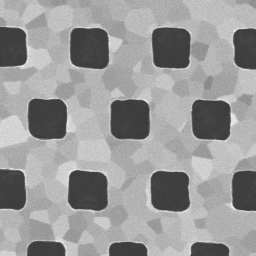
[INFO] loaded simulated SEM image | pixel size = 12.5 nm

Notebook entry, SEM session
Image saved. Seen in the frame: holes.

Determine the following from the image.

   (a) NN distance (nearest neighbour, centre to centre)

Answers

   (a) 1020 nm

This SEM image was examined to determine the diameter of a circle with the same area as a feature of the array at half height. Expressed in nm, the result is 540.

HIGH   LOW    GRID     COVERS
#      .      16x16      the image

################
################
..##...##...###.
..##...###..###.
################
################
##..###..###..##
##..###..###..##
##..###..###..##
################
################
..##...##...##..
..##...##...###.
################
################
##..###..###..##